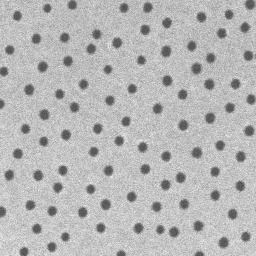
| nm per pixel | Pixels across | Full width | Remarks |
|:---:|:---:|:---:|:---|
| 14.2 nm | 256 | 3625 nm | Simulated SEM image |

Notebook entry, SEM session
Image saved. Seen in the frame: a regular array of holes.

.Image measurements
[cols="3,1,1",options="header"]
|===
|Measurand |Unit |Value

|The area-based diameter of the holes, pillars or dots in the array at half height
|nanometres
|150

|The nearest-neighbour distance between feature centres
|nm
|327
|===